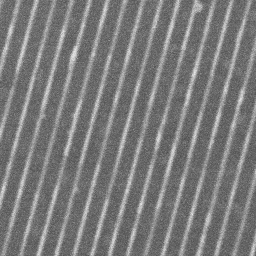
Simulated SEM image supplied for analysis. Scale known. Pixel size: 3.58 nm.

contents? parallel lines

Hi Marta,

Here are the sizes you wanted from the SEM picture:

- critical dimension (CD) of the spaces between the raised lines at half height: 13.8 pixels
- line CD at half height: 10.4 nanometers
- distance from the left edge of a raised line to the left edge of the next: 61.2 nm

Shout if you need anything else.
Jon